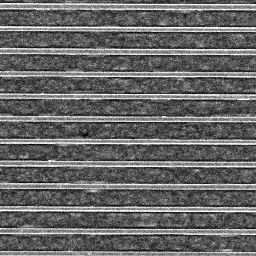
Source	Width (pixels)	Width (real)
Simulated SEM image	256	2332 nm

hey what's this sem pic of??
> parallel lines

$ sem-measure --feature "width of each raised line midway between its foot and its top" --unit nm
44.4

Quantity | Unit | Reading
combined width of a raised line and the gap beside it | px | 22.5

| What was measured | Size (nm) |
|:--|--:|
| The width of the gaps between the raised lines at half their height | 163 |